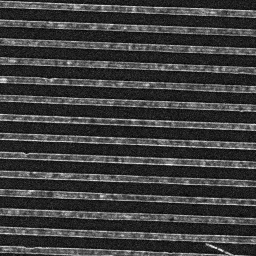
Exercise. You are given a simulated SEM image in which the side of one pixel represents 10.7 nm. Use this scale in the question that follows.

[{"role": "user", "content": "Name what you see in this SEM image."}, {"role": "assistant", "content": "parallel lines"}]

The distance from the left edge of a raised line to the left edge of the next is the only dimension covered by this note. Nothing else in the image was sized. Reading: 201 nm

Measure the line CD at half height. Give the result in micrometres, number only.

0.0692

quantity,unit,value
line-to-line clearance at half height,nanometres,130